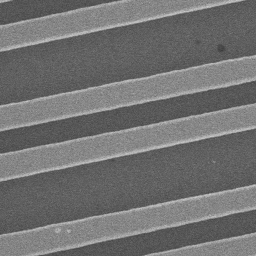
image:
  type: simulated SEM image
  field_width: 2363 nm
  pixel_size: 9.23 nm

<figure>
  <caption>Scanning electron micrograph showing lines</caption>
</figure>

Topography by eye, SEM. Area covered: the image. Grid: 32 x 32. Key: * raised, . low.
.............***************....
........***************.........
....***************.............
**************..................
*********.......................
****............................
................................
............................****
........................********
...................*************
..............****************..
.........****************.......
....***************.............
**************...............***
*********...............********
*****..............*************
..............****************..
.........****************.......
....****************............
***************.................
**********......................
******..........................
*...............................
..............................**
.........................*******
....................************
...............***************..
..........***************.......
.....****************...........
****************..............**
***********..............*******
*******.............************